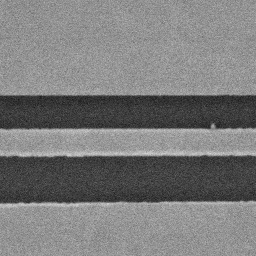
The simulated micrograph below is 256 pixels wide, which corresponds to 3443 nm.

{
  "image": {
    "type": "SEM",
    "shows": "lines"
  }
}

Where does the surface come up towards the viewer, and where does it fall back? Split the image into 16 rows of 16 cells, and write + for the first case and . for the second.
++++++++++++++++
++++++++++++++++
++++++++++++++++
++++++++++++++++
++++++++++++++++
++++++++++++++++
................
................
++++++++++++++++
++++++++++++++++
................
................
................
++++++++++++++++
++++++++++++++++
++++++++++++++++